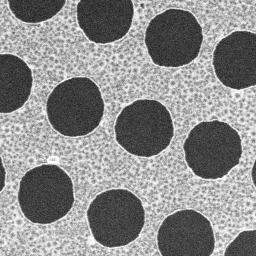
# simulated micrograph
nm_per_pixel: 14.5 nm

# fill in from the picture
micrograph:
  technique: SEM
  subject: holes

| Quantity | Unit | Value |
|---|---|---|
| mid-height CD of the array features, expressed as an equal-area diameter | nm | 861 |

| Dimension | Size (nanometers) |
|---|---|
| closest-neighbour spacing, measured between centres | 1060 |